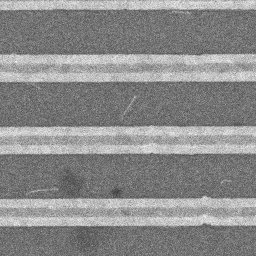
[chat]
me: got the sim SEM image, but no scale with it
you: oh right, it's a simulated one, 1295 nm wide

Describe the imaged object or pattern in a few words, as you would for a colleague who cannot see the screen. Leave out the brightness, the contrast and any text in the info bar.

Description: one or a few lines or trenches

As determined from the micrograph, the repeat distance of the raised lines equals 365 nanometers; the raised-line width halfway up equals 90.2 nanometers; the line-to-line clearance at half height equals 275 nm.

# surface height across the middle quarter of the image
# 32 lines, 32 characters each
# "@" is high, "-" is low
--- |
@@@@@@@@@@@@@@@@@@@@@@@@@@@@@@@@
@@@@@@@@@@@@@@@@@@@@@@@@@@@@@@@@
@@@@@@@@@@@@@@@@@@@@@@@@@@@@@@@@
--------------------------------
--------------------------------
--------------------------------
--------------------------------
--------------------------------
--------------------------------
--------------------------------
--------------------------------
--------------------------------
--------------------------------
--------------------------------
--------------------------------
--------------------------------
--------------------------------
@@@@@@@@@@@@@@@@@@@@@@@@@@@@@@@@
@@@@@@@@@@@@@@@@@@@@@@@@@@@@@@@@
@@@@@@@@@@@@@@@@@@@@@@@@@@@@@@@@
@@@@@@@@@@@@@@@@@@@@@@@@@@@@@@@@
--------------------------------
--------------------------------
--------------------------------
--------------------------------
--------------------------------
--------------------------------
--------------------------------
--------------------------------
--------------------------------
--------------------------------
--------------------------------